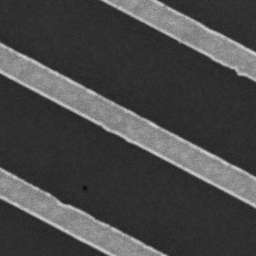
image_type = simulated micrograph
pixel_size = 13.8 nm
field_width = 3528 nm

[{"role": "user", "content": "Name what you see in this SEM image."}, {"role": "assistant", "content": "one or a few lines or trenches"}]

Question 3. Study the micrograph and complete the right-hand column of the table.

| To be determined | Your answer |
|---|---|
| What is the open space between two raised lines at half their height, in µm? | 1.19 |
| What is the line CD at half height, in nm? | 335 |